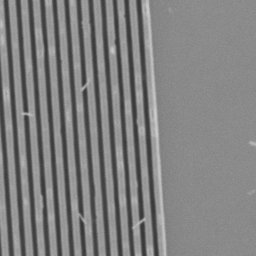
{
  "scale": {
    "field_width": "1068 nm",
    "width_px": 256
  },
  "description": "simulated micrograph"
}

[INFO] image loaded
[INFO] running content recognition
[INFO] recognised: parallel lines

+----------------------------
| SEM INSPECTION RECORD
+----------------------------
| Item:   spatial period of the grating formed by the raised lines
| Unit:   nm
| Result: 50.2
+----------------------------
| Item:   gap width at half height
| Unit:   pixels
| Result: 4.6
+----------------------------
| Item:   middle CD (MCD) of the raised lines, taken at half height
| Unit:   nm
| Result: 31.2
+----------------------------